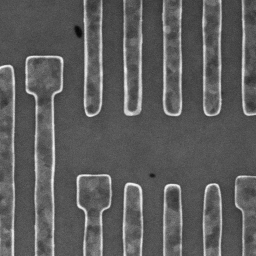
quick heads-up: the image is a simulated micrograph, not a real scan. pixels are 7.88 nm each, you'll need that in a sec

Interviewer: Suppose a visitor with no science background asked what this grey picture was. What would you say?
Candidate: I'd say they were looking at wiring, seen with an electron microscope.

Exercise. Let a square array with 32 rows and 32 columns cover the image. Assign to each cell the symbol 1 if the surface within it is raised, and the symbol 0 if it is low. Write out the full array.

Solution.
00000000000110001100111001110011
00000000000110001100111001110011
00000000000110001100111001110011
00000000000110001100111001110011
00000000000110001100011001100011
00000000000110001100011001100011
00000000000110001100011000100011
00011111000110001100011000100011
10011111000110001100011000100011
11011111000110001100011000100011
11011111000110001100011001100011
11001110000110001100011001100011
11001110000110001000011001100011
11000110000110001000011001100011
11000110000000000000000000000000
11000110000000000000000000000000
11000110000000000000000000000000
11001110000000000000000000000000
11001110000000000000000000000000
11001110000000000000000000000000
11001110000000000000000000000000
11000110000000000000000000000000
11001110001111000000000000000011
11001110001111001000010000100011
11001110001111001100011000110111
11001110001111001100011000110011
11001110000110001100011001110011
11001110000110011100011001110011
11001110000110011100011001110011
11001110000110011100011001110011
11001110000110001100011001100011
11001110000110001100011000100011